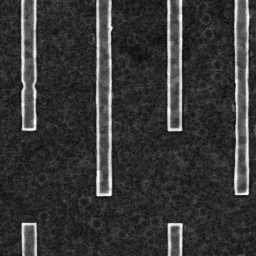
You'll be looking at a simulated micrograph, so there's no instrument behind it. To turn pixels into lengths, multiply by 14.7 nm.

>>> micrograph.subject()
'one or a few lines or trenches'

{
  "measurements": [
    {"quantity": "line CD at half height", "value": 185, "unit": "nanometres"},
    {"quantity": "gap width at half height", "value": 0.857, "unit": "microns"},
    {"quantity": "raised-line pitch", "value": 1040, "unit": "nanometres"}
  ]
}